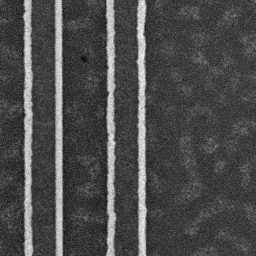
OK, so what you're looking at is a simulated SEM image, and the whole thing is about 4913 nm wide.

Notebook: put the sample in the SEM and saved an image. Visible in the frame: one or a few lines or trenches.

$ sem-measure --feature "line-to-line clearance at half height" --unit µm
0.993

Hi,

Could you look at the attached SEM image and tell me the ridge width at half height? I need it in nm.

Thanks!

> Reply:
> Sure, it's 595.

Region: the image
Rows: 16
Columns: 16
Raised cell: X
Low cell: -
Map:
--XX---XX-------
--XX---XX-------
--XX---XX-------
--XX---XX-------
--XX---XX-------
--XX---XX-------
--XX---XX-------
--XX---XX-------
--XX---XX-------
--XX---XX-------
--XX---XX-------
--XX---XX-------
--XX---XX-------
--XX---XX-------
--XX---XX-------
--XX---XX-------